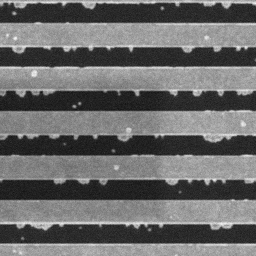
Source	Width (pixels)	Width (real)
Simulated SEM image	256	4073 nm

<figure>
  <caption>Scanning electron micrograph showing lines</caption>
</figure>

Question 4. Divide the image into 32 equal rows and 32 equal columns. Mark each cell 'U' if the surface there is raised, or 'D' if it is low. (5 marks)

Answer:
DDDDDDDDDDDDDDDDDDDDDDDDDDDDDDDD
DDDDDDDDDDDDDDDDDDDDDDDDDDDDDDDD
DDDDDDDDDDDDDDDDDDDDDDDDDDDDDDDD
UUUUUUUUUUUUUUUUUUUUUUUUUUUUUUUU
UUUUUUUUUUUUUUUUUUUUUUUUUUUUUUUU
UUUUUUUUUUUUUUUUUUUUUUUUUUUUUUUU
DDDDDDDDDDDDDDDDDDDDDDDDDDDDDDDD
DDDDDDDDDDDDDDDDDDDDDDDDDDDDDDDD
UUDUUUDUUUDUUUUUUUDUUUDUUUUUUUUU
UUUUUUUUUUUUUUUUUUUUUUUUUUUUUUUU
UUUUUUUUUUUUUUUUUUUUUUUUUUUUUUUU
DDDDDDDDDDDDDDDDDDDDDDDDDDDDDDDD
DDDDDDDDDDDDDDDDDDDDDDDDDDDDDDDD
DDDDDDDDDDDDDDDDDDDDDDDDDDDDDDDD
UUUUUUUUUUUUUUUUUUUUUUUUUUUUUUUU
UUUUUUUUUUUUUUUUUUUUUUUUUUUUUUUU
UUUUUUUUUUUUUUUUUUUUUUUUUUUUUUUU
DDDDDDDDDDDDDDDDDDDDDDDDDDDDDDDD
DDDDDDDDDDDDDDDDDDDDDDDDDDDDDDDD
DDDDDDDDDDDDDDDDDDDDDDDDDDDDDDUD
UUUUUUUUUUUUUUUUUUUUUUUUUUUUUUUU
UUUUUUUUUUUUUUUUUUUUUUUUUUUUUUUU
DDDDDDDDDDDDDDDDDDDDDDDDDDDDDDDD
DDDDDDDDDDDDDDDDDDDDDDDDDDDDDDDD
DDDDDDDDDDDDDDDDDDDDDDDDDDDDDDDD
UUUUUUUUUUUUUUUUUUUUUUUUUUUUUUUU
UUUUUUUUUUUUUUUUUUUUUUUUUUUUUUUU
UUUUUUUUUUUUUUUUUUUUUUUUUUUUUUUU
DDDDDDDDDDDDDDDDDDDDDDDDDDDDDDDD
DDDDDDDDDDDDDDDDDDDDDDDDDDDDDDDD
DDDDDDDDDDDDDDDDDDDDDDDDDDDDDDDD
UUUUUUUUUUUUUUUUUUUUUUUUUUUUUUUU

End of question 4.